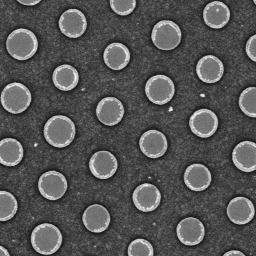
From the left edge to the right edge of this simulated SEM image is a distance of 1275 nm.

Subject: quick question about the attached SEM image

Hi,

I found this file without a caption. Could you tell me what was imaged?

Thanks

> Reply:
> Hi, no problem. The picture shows a regular array of raised bodies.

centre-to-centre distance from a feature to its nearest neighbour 269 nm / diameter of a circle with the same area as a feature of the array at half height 138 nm